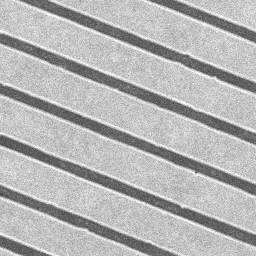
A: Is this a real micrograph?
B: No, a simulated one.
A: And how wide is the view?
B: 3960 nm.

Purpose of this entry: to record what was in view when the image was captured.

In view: parallel lines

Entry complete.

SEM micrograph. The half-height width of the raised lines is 35.6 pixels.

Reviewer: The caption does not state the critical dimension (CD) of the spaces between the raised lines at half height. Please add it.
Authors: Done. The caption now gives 183 nm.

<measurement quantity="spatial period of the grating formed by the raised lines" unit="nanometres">731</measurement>